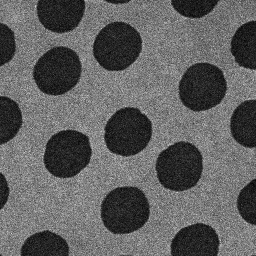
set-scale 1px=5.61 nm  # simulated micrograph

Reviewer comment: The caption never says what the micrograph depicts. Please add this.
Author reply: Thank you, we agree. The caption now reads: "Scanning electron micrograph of holes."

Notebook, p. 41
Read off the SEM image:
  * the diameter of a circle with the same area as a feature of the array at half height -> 272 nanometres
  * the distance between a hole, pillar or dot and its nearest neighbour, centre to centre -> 362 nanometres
